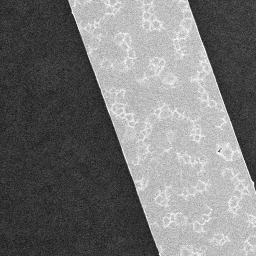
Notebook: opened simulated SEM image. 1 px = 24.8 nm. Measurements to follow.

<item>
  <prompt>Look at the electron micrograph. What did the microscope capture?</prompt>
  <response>one or a few lines or trenches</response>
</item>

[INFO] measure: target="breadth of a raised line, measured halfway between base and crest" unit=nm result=2760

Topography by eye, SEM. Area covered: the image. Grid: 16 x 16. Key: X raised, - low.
----XXXXXXXX----
-----XXXXXXX----
-----XXXXXXXX---
------XXXXXXX---
------XXXXXXX---
------XXXXXXXX--
-------XXXXXXX--
-------XXXXXXX--
-------XXXXXXXX-
--------XXXXXXX-
--------XXXXXXX-
--------XXXXXXXX
---------XXXXXXX
---------XXXXXXX
---------XXXXXXX
----------XXXXXX